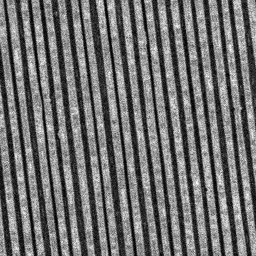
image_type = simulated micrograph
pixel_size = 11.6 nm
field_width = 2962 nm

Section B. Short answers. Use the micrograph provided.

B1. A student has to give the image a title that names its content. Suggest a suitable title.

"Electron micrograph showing parallel lines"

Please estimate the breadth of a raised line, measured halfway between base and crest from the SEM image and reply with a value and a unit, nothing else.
77.6 nm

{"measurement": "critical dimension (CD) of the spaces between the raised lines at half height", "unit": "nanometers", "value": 67.5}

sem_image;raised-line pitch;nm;144